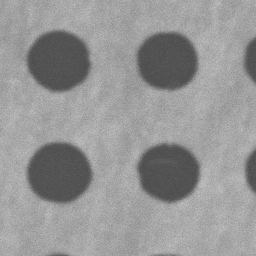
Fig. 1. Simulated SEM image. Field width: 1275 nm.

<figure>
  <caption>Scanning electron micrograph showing holes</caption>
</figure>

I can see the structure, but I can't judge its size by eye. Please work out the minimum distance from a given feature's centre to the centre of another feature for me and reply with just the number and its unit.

542 nm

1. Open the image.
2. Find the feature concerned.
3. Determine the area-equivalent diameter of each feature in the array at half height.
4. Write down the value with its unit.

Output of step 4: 304 nanometres